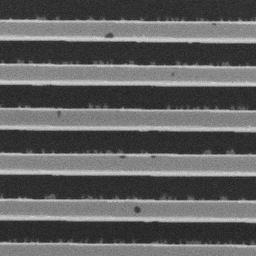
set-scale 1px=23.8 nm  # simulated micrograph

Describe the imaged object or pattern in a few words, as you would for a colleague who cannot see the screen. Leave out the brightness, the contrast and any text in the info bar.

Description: lines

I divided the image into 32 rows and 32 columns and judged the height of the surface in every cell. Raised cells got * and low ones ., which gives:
................................
................................
................................
********************************
********************************
................................
................................
................................
********************************
********************************
********************************
................................
................................
................................
********************************
********************************
................................
................................
................................
********************************
********************************
********************************
................................
................................
................................
********************************
********************************
................****************
................................
................................
********........................
********************************